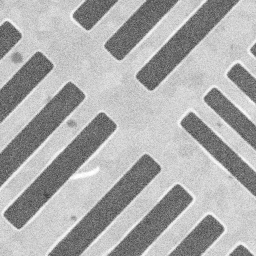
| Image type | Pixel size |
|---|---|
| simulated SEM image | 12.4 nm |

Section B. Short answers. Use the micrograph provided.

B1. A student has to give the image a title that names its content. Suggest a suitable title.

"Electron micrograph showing groups of lines, slits or small figures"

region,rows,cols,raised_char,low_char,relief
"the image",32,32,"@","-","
@@@@@@@@@@----@@@@----@@@-----@@
@@@@@@@@@-----@@@----@@@-----@@@
@@@@@@@@@----@@@----@@@-----@@@@
--@@@@@@@@--@@@----@@@-----@@@@@
---@@@@@@@@@@@----@@@-----@@@@@@
--@@@@@@@@@@@----@@@@----@@@@@@@
-@@@@@@@@@@@@---@@@@----@@@@@@@-
@@@---@@@@@@@@@@@@@----@@@@@@@@@
@@-----@@@@@@@@@@@----@@@@@@@--@
@@----@@@@@@@@@@@----@@@@@@@----
@----@@@-@@@@@@@@@--@@@@@@@@@---
----@@@---@@@@@@@@@@@@@@@@--@@--
---@@@----@@@@@@@@@@@@@@@----@@-
--@@@-----@@@@@@@@@@@@@@@@----@@
-@@@-----@@@--@@@@@@@@@--@@----@
@@@-----@@@---@@@@@@@@----@@----
@@-----@@@----@@@@@@@@@----@@---
@-----@@@----@@@@@@@@@@@----@@--
@----@@@-----@@@@@@@@@@@@----@@@
----@@@-----@@@@@@-@@@@@@@----@@
---@@@-----@@@@@@---@@@@@@@----@
--@@@-----@@@@@@----@@@@@@@@----
-@@@-----@@@@@@----@@@@@@@@@@@--
@@@-----@@@@@@----@@@--@@@@@@@@-
@@-----@@@@@@----@@@----@@@@@@@@
@-----@@@@@@----@@@-----@@@@@@@@
-----@@@@@@----@@@@----@@@@@@@@@
@---@@@@@@----@@@@----@@@--@@@@@
@@-@@@@@@----@@@-----@@@----@@@@
@@@@@@@@-----@@@----@@@-----@@@@
@@@@@@@-----@@@----@@@-----@@@@@
@@@@@@-----@@@----@@@-----@@@--@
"